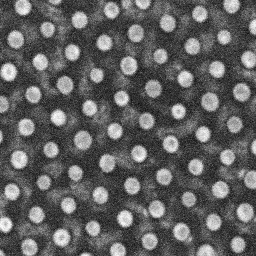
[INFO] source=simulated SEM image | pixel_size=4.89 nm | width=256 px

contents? a regular array of raised bodies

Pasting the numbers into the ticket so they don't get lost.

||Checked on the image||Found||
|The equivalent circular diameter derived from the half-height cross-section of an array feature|70.6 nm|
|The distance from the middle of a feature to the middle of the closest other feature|161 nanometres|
